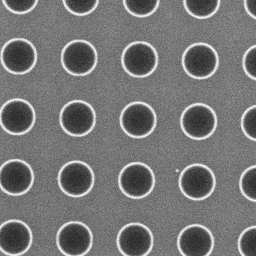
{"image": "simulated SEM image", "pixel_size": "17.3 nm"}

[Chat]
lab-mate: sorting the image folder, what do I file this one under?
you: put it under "an array of small figures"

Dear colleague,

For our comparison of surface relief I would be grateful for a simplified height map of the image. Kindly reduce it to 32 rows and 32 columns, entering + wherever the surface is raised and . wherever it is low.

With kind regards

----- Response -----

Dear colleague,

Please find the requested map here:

.+++....++++....++++...++++....+
..+......++.....+++.....+++....+
................................
................................
................................
.+++.....++.....+++.....+.......
++++....++++...++++....++++....+
+++++...++++...+++++...++++...++
.+++....++++....+++....++++....+
.................+......++.....+
................................
................................
.++.............................
++++....+++.....+++....+++.....+
++++....++++...++++....++++...++
++++....++++...++++....++++...++
.++.....+++.....+++....++++...++
................................
................................
................................
.++.....+++.....++..............
++++....++++...++++....+++.....+
++++...+++++...++++...+++++...++
++++....+++....++++....++++...++
.........+......++.....+++.....+
................................
................................
................................
++++....+++....+++.....+++.....+
++++...++++....++++...+++++...++
++++...++++....++++...+++++...++
+++.....+++....++++....+++....++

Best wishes